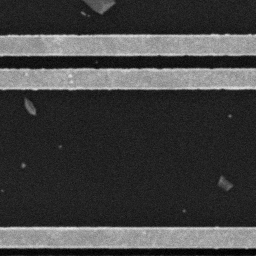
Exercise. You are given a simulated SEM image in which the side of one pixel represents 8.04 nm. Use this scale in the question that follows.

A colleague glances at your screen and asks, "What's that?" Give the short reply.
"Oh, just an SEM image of lines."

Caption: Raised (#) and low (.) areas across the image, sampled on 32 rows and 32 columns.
...........###..................
................................
................................
................................
.###############################
################################
################################
................................
................................
################################
################################
................................
................................
................................
................................
................................
................................
................................
................................
................................
................................
................................
................................
................................
................................
................................
................................
................................
################################
################################
################################
................................